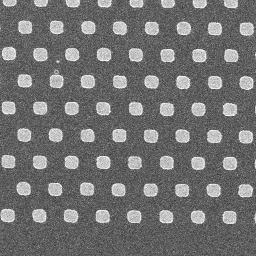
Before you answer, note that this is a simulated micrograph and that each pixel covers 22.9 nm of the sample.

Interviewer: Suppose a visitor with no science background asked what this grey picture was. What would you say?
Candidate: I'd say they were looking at a regular array of raised bodies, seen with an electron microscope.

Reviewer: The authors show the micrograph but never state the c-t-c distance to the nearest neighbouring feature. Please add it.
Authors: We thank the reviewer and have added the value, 709 nanometers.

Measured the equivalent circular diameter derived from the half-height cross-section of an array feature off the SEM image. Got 309 nanometers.